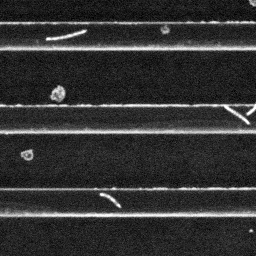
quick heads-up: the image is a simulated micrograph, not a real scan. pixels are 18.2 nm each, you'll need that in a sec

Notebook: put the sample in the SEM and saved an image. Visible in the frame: lines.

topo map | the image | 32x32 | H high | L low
LLLLLLLLLLLLLLLLLLLLLLLLLLLLLLLL
LLLLLLLLLLLLLLLLLLLLLLLLLLLLLLLL
LLLLLLLLLLLLLLLLLLLLLLLLLLLLLLLL
HHHHHHHHHHHHHHHHHHHHHHHHHHHHHHHH
HHHHHHHHHHHHHHHHHHHHHHHHHHHHHHHH
HHHHHHHHHHHHHHHHHHHHHHHHHHHHHHHH
LLLLLLLLLLLLLLLLLLLLLLLLLLLLLLLL
LLLLLLLLLLLLLLLLLLLLLLLLLLLLLLLL
LLLLLLLLLLLLLLLLLLLLLLLLLLLLLLLL
LLLLLLLLLLLLLLLLLLLLLLLLLLLLLLLL
LLLLLLLLLLLLLLLLLLLLLLLLLLLLLLLL
LLLLLLLLLLLLLLLLLLLLLLLLLLLLLLLL
LLLLLLLLLLLLLLLLLLLLLLLLLLLLLLLL
HHHHHHHHHHHHHHHHHHHHHHHHHHHHHHHH
HHHHHHHHHHHHHHHHHHHHHHHHHHHHHHHH
HHHHHHHHHHHHHHHHHHHHHHHHHHHHHHHH
LLLLLLLLLLLLLLLLLLLLLLLLLLLLLLLL
LLLLLLLLLLLLLLLLLLLLLLLLLLLLLLLL
LLLLLLLLLLLLLLLLLLLLLLLLLLLLLLLL
LLLLLLLLLLLLLLLLLLLLLLLLLLLLLLLL
LLLLLLLLLLLLLLLLLLLLLLLLLLLLLLLL
LLLLLLLLLLLLLLLLLLLLLLLLLLLLLLLL
LLLLLLLLLLLLLLLLLLLLLLLLLLLLLLLL
LLLLLLLLLLLLLLLLLLLLLLLLLLLLLLLL
HHHHHHHHHHHHHHHHHHHHHHHHHHHHHHHH
HHHHHHHHHHHHHHHHHHHHHHHHHHHHHHHH
HHHHHHHHHHHHHHHHHHHHHHHHHHHHHHHH
LLLLLLLLLLLLLLLLLLLLLLLLLLLLLLLL
LLLLLLLLLLLLLLLLLLLLLLLLLLLLLLLL
LLLLLLLLLLLLLLLLLLLLLLLLLLLLLLLL
LLLLLLLLLLLLLLLLLLLLLLLLLLLLLLLL
LLLLLLLLLLLLLLLLLLLLLLLLLLLLLLLL